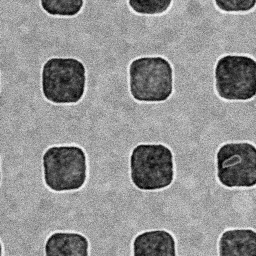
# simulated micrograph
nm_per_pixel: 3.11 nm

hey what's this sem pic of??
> holes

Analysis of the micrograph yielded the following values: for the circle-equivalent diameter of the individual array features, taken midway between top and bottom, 47.7 px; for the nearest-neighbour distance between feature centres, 87.1 px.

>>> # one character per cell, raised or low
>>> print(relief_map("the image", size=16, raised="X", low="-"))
XXX--XXX---XXX--
XXXXXXXXXXXXXXXX
XXXXXXXXXXXXXXXX
XXXXXXXXXXXXXX-X
XXX--XXX---XX---
XXX--XXX---XX---
XXXXXXXXXXXXXXXX
XXXXXXXXXXXXXXXX
XXXXXXXXXXXXXXXX
XXX--XXX---XXX--
XXX--XXX---XXX--
XXX--XXX---XXX--
XXXXXXXXXXXXXXXX
XXXXXXXXXXXXXXXX
XXXXXXXXX-XXXX--
XXX---XX---XXX--